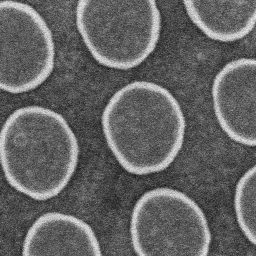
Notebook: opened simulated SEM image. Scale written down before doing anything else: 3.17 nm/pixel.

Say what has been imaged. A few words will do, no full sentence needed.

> raised bodies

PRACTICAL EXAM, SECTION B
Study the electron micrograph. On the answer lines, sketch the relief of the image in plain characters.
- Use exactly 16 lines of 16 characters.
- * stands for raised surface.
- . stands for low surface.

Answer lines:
**...*****..****
***..*****..****
***..*****......
***...***.......
***...........**
**......**...***
.......****..***
.***...****...**
****...****....*
*****..****.....
****....**......
.***...........*
.........***...*
...*....*****..*
..****..*****..*
..****...****...